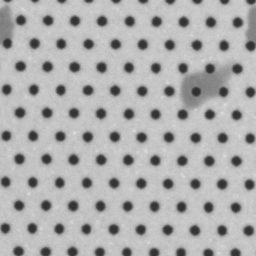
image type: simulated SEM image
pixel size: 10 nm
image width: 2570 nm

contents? a regular array of holes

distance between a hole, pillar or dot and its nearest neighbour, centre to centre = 267 nanometers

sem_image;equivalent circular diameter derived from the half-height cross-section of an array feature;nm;101